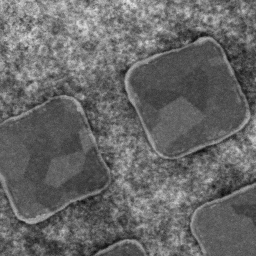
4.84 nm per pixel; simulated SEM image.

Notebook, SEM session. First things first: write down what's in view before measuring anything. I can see raised bodies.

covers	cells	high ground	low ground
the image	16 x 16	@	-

----------------
----------------
----------------
----------@@@@--
--------@@@@@@--
--------@@@@@@@-
---@@---@@@@@@@-
@@@@@----@@@@@@-
@@@@@@---@@@@@--
@@@@@@----@@----
@@@@@@@---------
@@@@@@@---------
-@@@@---------@@
-@@---------@@@@
------------@@@@
-------@@----@@@